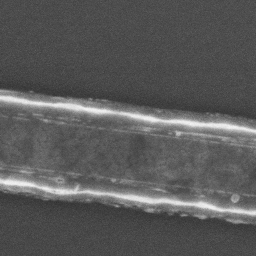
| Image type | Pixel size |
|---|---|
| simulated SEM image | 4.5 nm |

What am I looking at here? one or a few lines or trenches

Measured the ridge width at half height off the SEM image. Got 370 nm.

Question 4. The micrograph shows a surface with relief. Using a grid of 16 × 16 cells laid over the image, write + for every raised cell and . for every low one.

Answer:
................
................
................
................
................
................
++..............
++++++++++......
++++++++++++++++
++++++++++++++++
++++++++++++++++
..++++++++++++++
.........+++++++
................
................
................